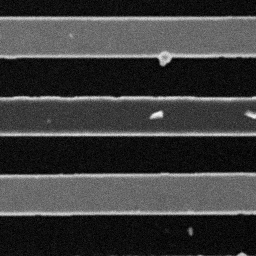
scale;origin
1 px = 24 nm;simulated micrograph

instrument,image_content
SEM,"lines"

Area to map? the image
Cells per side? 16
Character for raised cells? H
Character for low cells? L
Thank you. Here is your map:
LLLLLLLLLLLLLLLL
HHHHHHHHHHHHHHHH
HHHHHHHHHHHHHHHH
HHHHHHHHHHHHHHLL
LLLLLLLLLLLLLLLL
LLLLLLLLLLLLLLLL
HHHHHHHHHHHHHHHH
HHHHHHHHHHHHHHHH
LLLLLLLLLLLLLLLL
LLLLLLLLLLLLLLLL
LLLLLLLLLLLLLLLL
HHHHHHHHHHHHHHHH
HHHHHHHHHHHHHHHH
LLLLLLLLLLLLLLLL
LLLLLLLLLLLLLLLL
LLLLLLLLLLLLLLLL